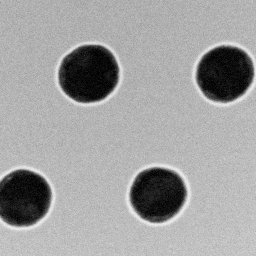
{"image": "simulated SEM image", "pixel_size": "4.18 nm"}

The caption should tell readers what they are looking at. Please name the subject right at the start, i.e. holes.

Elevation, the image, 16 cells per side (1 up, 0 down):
1111111111111111
1111111111111111
1111111111111111
1111000111111000
1111000111110000
1111000111110000
1111111111111111
1111111111111111
1111111111111111
1111111111111111
1111111110111111
0001111100001111
0001111100001111
0001111110011111
1111111111111111
1111111111111111